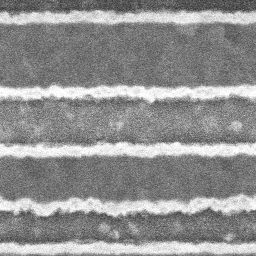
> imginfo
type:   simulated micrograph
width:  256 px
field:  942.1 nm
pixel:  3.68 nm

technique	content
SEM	one or a few lines or trenches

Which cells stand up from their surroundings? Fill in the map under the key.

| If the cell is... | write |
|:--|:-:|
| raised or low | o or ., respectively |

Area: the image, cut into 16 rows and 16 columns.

................
oooooooooooooooo
oooooooooooooooo
oooooooooooooooo
oooooooooooooooo
oooooooooooooooo
................
................
................
oooooooooooooooo
oooooooooooooooo
oooooooooooooooo
oooooooooooooooo
................
................
............oo.o